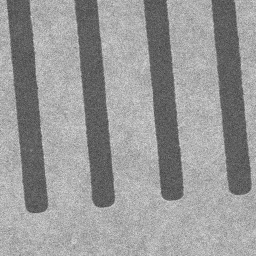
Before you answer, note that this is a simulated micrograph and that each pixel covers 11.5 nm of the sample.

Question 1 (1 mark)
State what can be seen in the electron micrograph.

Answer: one or a few lines or trenches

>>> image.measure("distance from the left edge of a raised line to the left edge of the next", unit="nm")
784